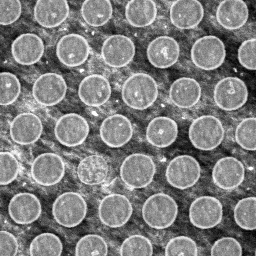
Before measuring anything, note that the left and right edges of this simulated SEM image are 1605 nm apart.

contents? a regular array of raised bodies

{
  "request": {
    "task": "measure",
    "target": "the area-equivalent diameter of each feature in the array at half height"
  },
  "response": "200 nanometres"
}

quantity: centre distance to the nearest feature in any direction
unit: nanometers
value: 283